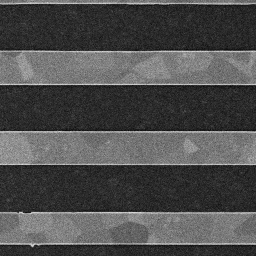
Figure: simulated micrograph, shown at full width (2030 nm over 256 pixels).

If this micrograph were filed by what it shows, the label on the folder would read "one or a few lines or trenches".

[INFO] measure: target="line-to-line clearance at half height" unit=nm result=379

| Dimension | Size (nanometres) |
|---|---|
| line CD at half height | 260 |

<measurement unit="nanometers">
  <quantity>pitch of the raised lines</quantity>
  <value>638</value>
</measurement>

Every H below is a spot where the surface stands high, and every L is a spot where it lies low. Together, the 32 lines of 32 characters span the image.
LLLLLLLLLLLLLLLLLLLLHLLLLLLLLLLL
LLLLLLLLLLLLLLLLLLLLLLLLLLLLLLLL
LLLLLLLLLLLLLLLLLLLLLLLLLLLLLLLL
LLLLLLLLLLLLLLLLLLLLLLLLLLLLLLLL
LLLLLLLLLLLLLLLLLLLLLLLLLLLLLLLL
LLLLLLLLLLLLLLLLLLLLLLLLLLLLLLLL
HHHHHHHHHHHHHHHHHHHHHHHLLLLLLLHH
HHHHHHHHHHHHHHHHHHHHHHHHHHHHHHHH
HHHHHHHHHHHHHHHHHHHHHHHHHHHHHHHH
HHHHHHHHHHHHHHHHHHHHHHHHHHHHHHHH
HLHHHHHHHHLLHHHHLLLLLLLLHHHLLLHH
LLLLLLLLLLLLLLLLLLLLLLLLLLLLLLLL
LLLLLLLLLLLLLLLLLLLLLLLLLLLLLLLL
LLLLLLLLLLLLLLLLLLLLLLLLLLLLLLLL
LLLLLLLLLLLLLLLLLLLLLLLLLLLLLLLL
LLLLLLLLLLLLLLLLLLLLLLLLLLLLLLLL
HLLLLLLHLLLLLLLLLLLLLLLLLLLLLLLH
HHHHHHHHHHHHHHHHHHHHHHHHHHHHHHHH
HHHHHHHHHHHHHHHHHHHHHHHHHHHHHHHH
HHHHHHHHHHHHHHHHHHHHHHHHHHHHHHHH
HHHHHHHHHHHHHHHHHHHHHHHHHHHHHHHH
LLLLLLLLLLLLLLLLLLLLLLLLLLLLLLLL
LLLLLLLLLLLLLLLLLLLLLLLLLLLLLLLL
LLLLLLLLLLLLLLLLLLLLLLLLLLLLLLLL
LLLLLLLLLLLLLLLLLLLLLLLLLLLLLLLL
LLLLLLLLLLLLLLLLLLLLLLLLLLLLLLLL
LLLLLLLLLLLLLLLLLLLLLLLLLLLLLLLL
HHHHHHHHHHHHHHHHHHHHHHHHHHHHHHHH
HHHHHHHHHHHHHHHHHHHHHHHHHHHHHHHH
HHHHHHHHHHHHHHHHHHHHHHHHHHHHHHHH
HHHHHHHLLLLLLLLLLLLLLLHHHHHHHLLL
LLLLLLLLLLLLLLLLLLLLLLLLLLLLLLLL